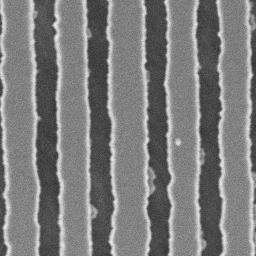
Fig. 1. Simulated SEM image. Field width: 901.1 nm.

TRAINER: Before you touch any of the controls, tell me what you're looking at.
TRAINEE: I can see lines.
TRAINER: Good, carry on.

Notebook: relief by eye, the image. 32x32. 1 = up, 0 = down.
11110001111000111100011110011110
11110001111001111100011110011110
11110001111001111100011110011110
11110001111001111100011110001110
11110001111001111100011100011110
11110001111000111100011110001110
11110001111000111100011110001110
11110001111001111100011110011110
11111001111000111100011110011110
11111001111001111100011110011111
11110001111001111100011110011110
11110001111001111100011110001110
11110001111001111100011110001110
11111001111001111100011110001110
11111001111000111100011110001110
11111001111000111100011110011110
11111001111000111100011110011110
11111001111000111110011110011110
11111001111000111100011110011110
11111001111000111110011110011110
01111001111000111100011110001110
01111001111000111100011110001110
01111001111000111100011110011111
01111000111000111110011110011111
01111001111000111100011110001111
01111001111000111100011110001111
01111000111000111100011110001111
01111001111000111110011110001111
11111000111000111110011110001111
01111000111000111110011110001111
01111000111000111110011110001111
01111000111000111110011110001111